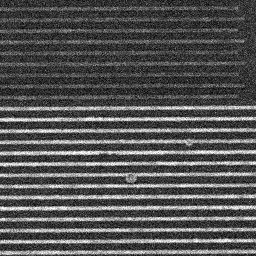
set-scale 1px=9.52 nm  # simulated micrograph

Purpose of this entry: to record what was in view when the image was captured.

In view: parallel lines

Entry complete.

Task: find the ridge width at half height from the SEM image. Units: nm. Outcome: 22.6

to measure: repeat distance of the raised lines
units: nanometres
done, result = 105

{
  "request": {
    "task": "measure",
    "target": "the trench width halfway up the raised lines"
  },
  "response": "84.5 nm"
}